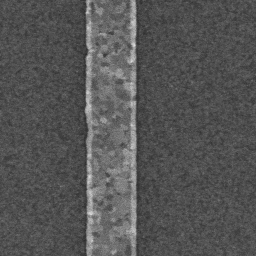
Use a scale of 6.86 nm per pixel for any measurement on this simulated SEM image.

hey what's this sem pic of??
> one or a few lines or trenches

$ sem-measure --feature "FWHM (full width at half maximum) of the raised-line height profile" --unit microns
0.306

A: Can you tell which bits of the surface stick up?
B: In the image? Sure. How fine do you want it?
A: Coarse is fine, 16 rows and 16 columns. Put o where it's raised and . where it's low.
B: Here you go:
......oo........
......oo........
......oo........
......oo........
.....ooo........
.....ooo........
.....ooo........
......oo........
......oo........
......oo........
......oo........
......oo........
......oo........
......oo........
......oo........
......oo........